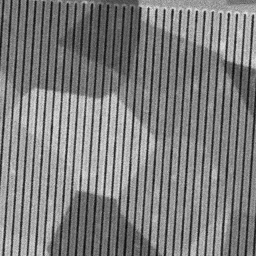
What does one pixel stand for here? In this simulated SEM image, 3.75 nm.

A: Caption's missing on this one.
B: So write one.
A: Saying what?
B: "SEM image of parallel lines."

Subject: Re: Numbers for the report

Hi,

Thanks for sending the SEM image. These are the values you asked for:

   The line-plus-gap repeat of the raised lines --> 0.0302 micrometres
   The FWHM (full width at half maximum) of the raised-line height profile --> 0.0224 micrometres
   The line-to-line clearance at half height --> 9.3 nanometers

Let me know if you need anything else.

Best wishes